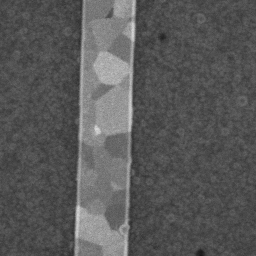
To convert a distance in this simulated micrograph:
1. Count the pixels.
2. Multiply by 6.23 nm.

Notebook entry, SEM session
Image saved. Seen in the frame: one or a few lines or trenches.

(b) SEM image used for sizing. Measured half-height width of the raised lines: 305 nm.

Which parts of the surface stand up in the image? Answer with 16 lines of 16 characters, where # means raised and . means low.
.....###........
.....###........
.....###........
.....###........
.....###........
.....###........
.....###........
.....###........
.....###........
.....###........
.....###........
.....###........
.....###........
.....###........
.....###........
.....###........